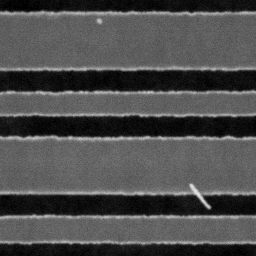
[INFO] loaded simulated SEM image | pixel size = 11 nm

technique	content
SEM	lines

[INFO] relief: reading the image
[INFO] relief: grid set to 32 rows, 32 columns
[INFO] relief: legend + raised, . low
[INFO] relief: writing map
................................
................................
++++++++++++++++++++++++++++++++
++++++++++++++++++++++++++++++++
++++++++++++++++++++++++++++++++
++++++++++++++++++++++++++++++++
++++++++++++++++++++++++++++++++
++++++++++++++++++++++++++++++++
++++++++++++++++++++++++++++++++
................................
................................
.+..+...+++++++...++++++++++++++
++++++++++++++++++++++++++++++++
++++++++++++++++++++++++++++++++
++.....++.........++.+++.+++.+..
................................
................................
++++++++++++++++++++++++++++++++
++++++++++++++++++++++++++++++++
++++++++++++++++++++++++++++++++
++++++++++++++++++++++++++++++++
++++++++++++++++++++++++++++++++
++++++++++++++++++++++++++++++++
++++++++++++++++++++++++++++++++
................................
................................
................................
++++++++++++++++++++++++++++++++
++++++++++++++++++++++++++++++++
++++++++++++++++++++++++++++++++
...............+........+.......
................................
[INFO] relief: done